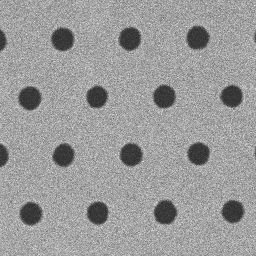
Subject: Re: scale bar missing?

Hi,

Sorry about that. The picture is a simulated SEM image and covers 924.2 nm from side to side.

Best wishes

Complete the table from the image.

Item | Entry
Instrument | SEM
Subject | a regular array of holes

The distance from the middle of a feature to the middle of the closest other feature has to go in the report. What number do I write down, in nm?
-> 242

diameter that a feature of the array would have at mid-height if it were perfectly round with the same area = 83.9 nm